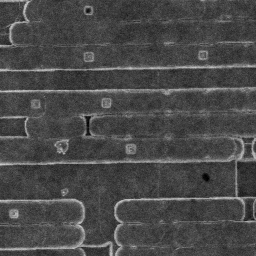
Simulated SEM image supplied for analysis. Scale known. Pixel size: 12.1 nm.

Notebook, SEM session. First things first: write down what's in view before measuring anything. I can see wiring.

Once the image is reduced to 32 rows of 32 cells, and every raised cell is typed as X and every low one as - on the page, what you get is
---XXXXXXXXXXXXXXXXXXXXXXXXXXXXX
---XXXXXXXXXXXXXXXXXXXXXXXXXXXXX
---XXXXXXXXXXXXXXXXXXXXXXXXXXXXX
-XXXXXXXXXXXXXXXXXXXXXXXXXXXXXXX
-XXXXXXXXXXXXXXXXXXXXXXXXXXXXXXX
-XXXXXXXXXXXXXXXXXXXXXXXXXXXXXXX
XXXXXXXXXXXXXXXXXXXXXXXXXXXXXXXX
XXXXXXXXXXXXXXXXXXXXXXXXXXXXXXXX
XXXXXXXXXXXXXXXXXXX-------------
--------------------------------
--------------------------------
XXXXXXXXXXXXXXXXXXXX-XXXXXXXXXXX
XXXXXXXXXXXXX-XXXXXXXXXXXXXXXXXX
XXXXXXXXXXXXXXXXXXXXXXXXXXXXXXXX
XXXXXXXXXXXXXXXXXXXXXXXXXXXXXXXX
---XXXXXXXXXXXXXXXXXXXXXXXXXXXXX
---XXXXXXXXXXXXXXXXXXXXXXXXXXXXX
XXXXXXXXXXXXXXXXXXXXXXXXXXXXXX--
XXXXXXXXXXXXXXXX-XXXXXXXXXXXXX--
XXXXXXXXXXXXXXXXXXXXXXXXXXXXXX--
--------------------------------
--------------------------------
--------------------------------
--------------------------------
--------------------------------
XXXXXXXXXX-----XXXXXXXXXXXXXXXX-
XXXXXXXXXX----XXXXXXXXXXXXXXXXX-
XXXXXXXXXX-----XXXXXXXXXXXXXXXXX
XXXXXXXXXX-----XXXXXXXXXXXXXXXXX
XXXXXXXXXX----XXXXXXXXXXXXXXXXXX
XXXXXXXXXX-----XXXXXXXXXXXXXXXXX
---------------XXXXXXXXXXXXXXXXX